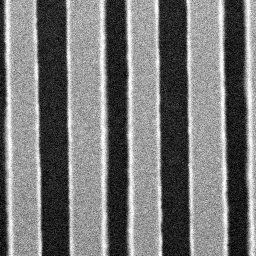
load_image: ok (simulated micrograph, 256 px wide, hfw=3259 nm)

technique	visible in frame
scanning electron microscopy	lines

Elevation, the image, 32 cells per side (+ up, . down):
.+++....+++++...++++...+++++...+
.+++....+++++...++++....++++...+
.+++....+++++...++++....++++...+
.++++...+++++...++++....++++...+
.++++...+++++...++++....++++...+
.++++...+++++...++++....++++...+
.++++...+++++...++++....++++...+
.++++...+++++...++++....++++...+
.++++....++++...++++....++++...+
.++++....++++...++++....++++...+
.++++....++++...++++....++++...+
.++++....++++...++++....++++...+
.++++....++++...++++....++++...+
.++++....++++...++++....++++...+
.++++....++++...++++....++++...+
.++++....++++...++++....++++...+
.++++....++++...++++....++++...+
.++++....++++...++++....++++...+
.++++....++++...++++....++++...+
.++++....++++...++++....++++...+
.++++....++++...++++....++++...+
.++++....++++...++++....++++...+
.++++....++++...++++....++++...+
.++++....++++...++++....++++...+
.++++....++++...++++....++++...+
.++++....++++...++++....++++...+
.++++....++++...++++....++++...+
.++++....++++...++++....++++...+
.++++....++++...++++....++++...+
.++++....++++...++++....++++...+
.++++....++++...++++....++++...+
.++++....++++...++++....++++...+